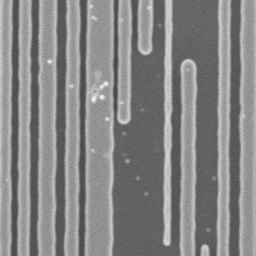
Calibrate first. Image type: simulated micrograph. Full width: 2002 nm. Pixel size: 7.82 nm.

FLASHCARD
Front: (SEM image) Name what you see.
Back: groups of lines, slits or small figures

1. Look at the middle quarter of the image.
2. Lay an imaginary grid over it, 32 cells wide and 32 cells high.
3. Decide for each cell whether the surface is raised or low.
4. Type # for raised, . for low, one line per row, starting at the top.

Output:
.###..######..###........##..###
.###..######..###.........#..###
.###..######..###........##..###
.###..######..###........##..###
.###..######..###........##..###
.###..######..###........##..###
####..######..###........##..###
####..######..###........##...##
####..######.####........##...##
.###..######.###.........##...##
####..######..##.........##...##
####..######.###.........##...##
.###..######.###.........##...##
.###..######.###..........#...##
.###.#######..##.........##...##
.###.#######.............##..###
####.#######.............##..###
####.#######.............##..###
####..######.............##..###
####..######.............##..###
####..######.............##..###
####..######.............##...##
####..######..............#..###
####..######.............##..###
###...######.............##..###
###...######.............##..###
####..######.............##...##
####..######.............##...##
####..######.............##...##
####..######.............##..###
####..######.............##..###
####..######.............##..###